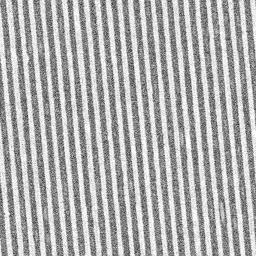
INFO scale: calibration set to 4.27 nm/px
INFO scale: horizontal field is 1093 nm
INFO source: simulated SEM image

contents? parallel lines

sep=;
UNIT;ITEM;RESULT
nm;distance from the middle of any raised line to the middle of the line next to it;47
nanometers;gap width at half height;29.7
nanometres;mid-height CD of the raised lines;14.9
